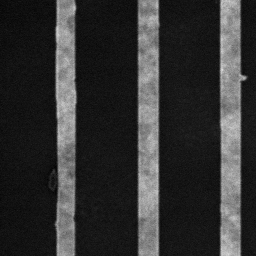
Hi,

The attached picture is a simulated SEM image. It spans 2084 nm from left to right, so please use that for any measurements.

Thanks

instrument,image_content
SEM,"one or a few lines or trenches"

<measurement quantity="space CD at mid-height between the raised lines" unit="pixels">63.6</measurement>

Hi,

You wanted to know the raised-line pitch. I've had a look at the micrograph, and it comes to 669 nanometres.